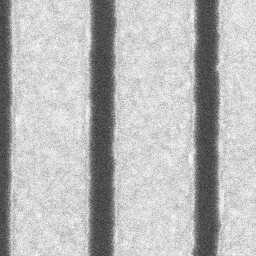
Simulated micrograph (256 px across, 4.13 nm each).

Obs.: one or a few lines or trenches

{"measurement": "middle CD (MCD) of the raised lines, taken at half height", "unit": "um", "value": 0.119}